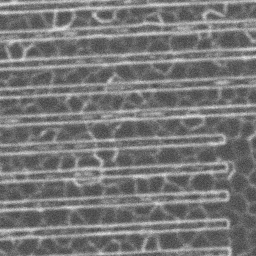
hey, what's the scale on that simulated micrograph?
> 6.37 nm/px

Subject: parallel lines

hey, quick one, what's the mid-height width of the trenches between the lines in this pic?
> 0.0469 um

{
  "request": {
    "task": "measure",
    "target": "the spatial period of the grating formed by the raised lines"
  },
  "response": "180 nm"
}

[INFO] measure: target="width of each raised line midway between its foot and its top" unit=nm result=132